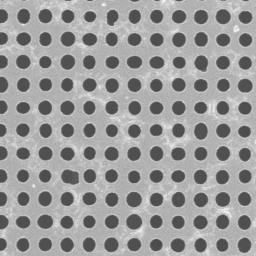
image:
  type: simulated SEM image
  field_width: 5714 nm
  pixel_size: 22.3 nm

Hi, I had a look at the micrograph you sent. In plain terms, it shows a regular array of holes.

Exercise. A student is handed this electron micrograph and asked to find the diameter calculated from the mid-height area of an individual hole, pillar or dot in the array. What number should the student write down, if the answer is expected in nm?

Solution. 310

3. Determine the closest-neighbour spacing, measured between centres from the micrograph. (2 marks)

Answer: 490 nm